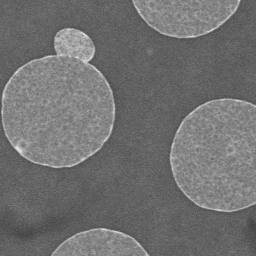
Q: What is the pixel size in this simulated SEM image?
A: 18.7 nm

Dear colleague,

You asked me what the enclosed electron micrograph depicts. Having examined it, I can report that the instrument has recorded raised bodies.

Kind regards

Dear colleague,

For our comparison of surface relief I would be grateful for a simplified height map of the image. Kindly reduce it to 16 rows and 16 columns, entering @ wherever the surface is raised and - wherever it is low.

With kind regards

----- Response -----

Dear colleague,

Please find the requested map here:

---------@@@@@@-
---------@@@@@--
----@@----------
---@@@----------
-@@@@@----------
@@@@@@@---------
@@@@@@@------@@-
@@@@@@@-----@@@@
@@@@@@@----@@@@@
-@@@@@-----@@@@@
-----------@@@@@
-----------@@@@@
------------@@@@
----------------
-----@@---------
----@@@@@-------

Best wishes